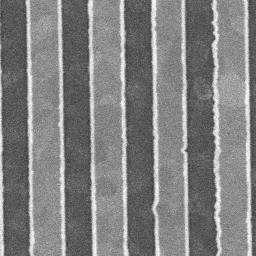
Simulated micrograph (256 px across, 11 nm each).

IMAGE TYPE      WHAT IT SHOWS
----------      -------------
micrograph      one or a few lines or trenches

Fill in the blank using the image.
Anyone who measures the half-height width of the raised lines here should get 348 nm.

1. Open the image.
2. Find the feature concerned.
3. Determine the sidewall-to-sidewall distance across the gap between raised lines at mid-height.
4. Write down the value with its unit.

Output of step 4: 338 nm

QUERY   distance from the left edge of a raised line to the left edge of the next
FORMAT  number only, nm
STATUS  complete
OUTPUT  685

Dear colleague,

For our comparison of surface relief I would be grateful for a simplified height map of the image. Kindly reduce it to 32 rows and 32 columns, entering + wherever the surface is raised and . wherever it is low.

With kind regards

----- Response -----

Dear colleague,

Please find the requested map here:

...++++....++++....++++....++++.
....+++....++++....++++....++++.
....+++....++++....++++....++++.
....+++....++++....++++....++++.
....+++....++++....++++....++++.
....+++....++++....++++....++++.
....++++...++++....++++....++++.
....++++...++++....++++....++++.
....++++...++++....++++....++++.
....++++...++++....++++....++++.
....++++...++++....++++....++++.
....++++....+++....++++....++++.
....++++....+++....++++....++++.
....++++....+++....++++....++++.
....++++....+++....++++....++++.
....++++....+++....++++....++++.
....++++....++++...++++....++++.
....++++....++++....+++....++++.
....++++....+++.....+++....++++.
....++++....++++....+++....++++.
....++++....+++....++++....++++.
....++++....++++....+++....++++.
....++++....++++....+++....++++.
....++++....++++....+++....++++.
....++++....++++....+++....++++.
....++++....++++...++++....++++.
....++++....++++...++++....++++.
....++++....++++....+++....++++.
....++++....++++....+++....++++.
....++++....++++....+++....++++.
....++++....++++....+++....++++.
....++++....++++....+++....++++.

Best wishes